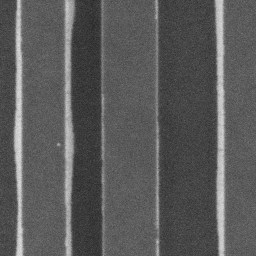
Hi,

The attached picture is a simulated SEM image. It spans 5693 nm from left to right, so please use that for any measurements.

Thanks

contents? lines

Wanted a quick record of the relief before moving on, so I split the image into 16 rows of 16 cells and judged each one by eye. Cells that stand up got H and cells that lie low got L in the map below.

LHHHLLHHHHLLLLHH
LHHHLLHHHHLLLLHH
LHHHLLHHHHLLLLHH
LHHHLLHHHHLLLLHH
LHHHLLHHHHLLLLHH
LHHHLLHHHHLLLLHH
LHHHLLHHHHLLLLHH
LHHHLLHHHHLLLLHH
LHHHLLHHHHLLLLHH
LHHHLLHHHHLLLLHH
LHHHLLHHHHLLLLHH
LHHHLLHHHHLLLLHH
LHHHLLHHHHLLLLHH
LHHHLLHHHHLLLLHH
LHHHLLHHHHLLLLHH
LHHHLLHHHHLLLLHH